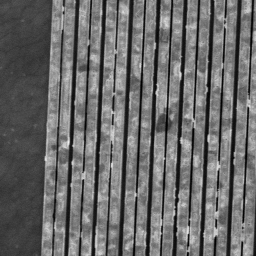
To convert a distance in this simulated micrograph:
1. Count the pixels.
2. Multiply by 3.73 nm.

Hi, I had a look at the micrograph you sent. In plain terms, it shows parallel lines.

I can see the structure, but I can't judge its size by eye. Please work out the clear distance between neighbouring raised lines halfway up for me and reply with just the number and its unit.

0.0074 microns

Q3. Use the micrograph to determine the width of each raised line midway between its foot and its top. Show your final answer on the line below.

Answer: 39.6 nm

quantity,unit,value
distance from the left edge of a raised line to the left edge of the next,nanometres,50.1